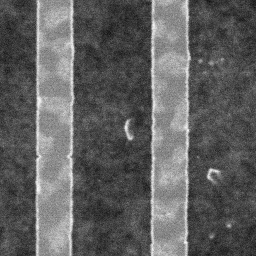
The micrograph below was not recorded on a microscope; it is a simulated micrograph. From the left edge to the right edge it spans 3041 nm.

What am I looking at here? one or a few lines or trenches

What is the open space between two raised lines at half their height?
80.5 px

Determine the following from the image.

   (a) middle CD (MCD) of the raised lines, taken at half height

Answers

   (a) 0.41 microns